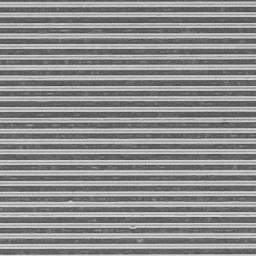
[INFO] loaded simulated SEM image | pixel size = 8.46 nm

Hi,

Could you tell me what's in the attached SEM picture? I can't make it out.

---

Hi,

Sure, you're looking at parallel lines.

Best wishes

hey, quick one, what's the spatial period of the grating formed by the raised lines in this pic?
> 89.1 nanometres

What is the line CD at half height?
0.0254 micrometres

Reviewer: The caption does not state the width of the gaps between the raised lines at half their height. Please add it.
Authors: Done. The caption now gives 66.6 nanometers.